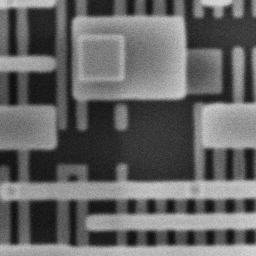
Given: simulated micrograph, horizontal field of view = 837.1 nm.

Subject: wiring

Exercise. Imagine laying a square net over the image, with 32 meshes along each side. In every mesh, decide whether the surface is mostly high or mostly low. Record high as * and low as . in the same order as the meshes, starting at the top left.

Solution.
*******...................***...
................................
.........**************.........
.........**************.........
.........**************.........
.........**************.........
.........**************.........
*******..**************.........
*******..**************.........
.........**************.........
.........**************.........
.........**************.........
................................
*******...................******
*******..................*******
*******..................*******
*******..................*******
*******..................*******
*******.........................
................................
................................
................................
................................
********************************
********************************
................................
................................
...........*********************
...........*********************
................................
................................
********************************